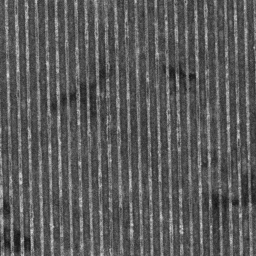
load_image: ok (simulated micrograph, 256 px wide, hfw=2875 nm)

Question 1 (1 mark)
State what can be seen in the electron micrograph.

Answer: parallel lines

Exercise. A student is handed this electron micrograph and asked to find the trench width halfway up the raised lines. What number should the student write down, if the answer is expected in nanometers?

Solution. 88.4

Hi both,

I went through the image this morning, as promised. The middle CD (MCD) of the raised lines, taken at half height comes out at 19.7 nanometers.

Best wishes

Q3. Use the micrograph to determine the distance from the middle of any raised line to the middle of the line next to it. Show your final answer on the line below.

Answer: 0.112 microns